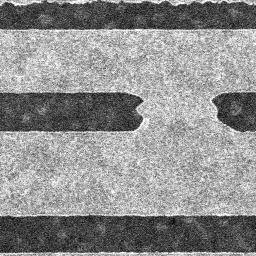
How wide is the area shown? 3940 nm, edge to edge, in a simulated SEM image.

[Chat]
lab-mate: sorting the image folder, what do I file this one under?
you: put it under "one or a few lines or trenches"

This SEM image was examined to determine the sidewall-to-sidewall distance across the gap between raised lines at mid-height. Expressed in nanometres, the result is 575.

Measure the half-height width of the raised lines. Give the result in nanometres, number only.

1170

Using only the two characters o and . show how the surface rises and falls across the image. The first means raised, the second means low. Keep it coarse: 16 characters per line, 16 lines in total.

................
................
oooooooooooooooo
oooooooooooooooo
oooooooooooooooo
oooooooooooooooo
.........oooo...
.........ooooo..
oooooooooooooooo
oooooooooooooooo
oooooooooooooooo
oooooooooooooooo
oooooooooooooooo
................
................
................